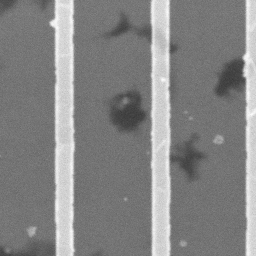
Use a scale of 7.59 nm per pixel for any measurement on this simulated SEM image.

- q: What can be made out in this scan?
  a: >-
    lines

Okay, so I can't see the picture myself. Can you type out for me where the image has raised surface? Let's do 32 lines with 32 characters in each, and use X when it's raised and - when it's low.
-------XX----------XX----------X
-------XX----------XX----------X
-------XX----------XX----------X
-------XX----------XX----------X
-------XX----------XX----------X
-------XX----------XX----------X
-------XX----------XX----------X
-------XX----------XX----------X
-------XX----------XX----------X
-------XX----------XX----------X
-------XX----------XX----------X
-------XX----------XX----------X
-------XX----------XX----------X
-------XX----------XX----------X
-------XX----------XX----------X
-------XX----------XX----------X
-------XX----------XX----------X
-------XX----------XX----------X
-------XX----------XX----------X
-------XX----------XX----------X
-------XX----------XX----------X
-------XX----------XX----------X
-------XX----------XX----------X
-------XX----------XX----------X
-------XX----------XX----------X
-------XX----------XX----------X
-------XX----------XX----------X
-------XX----------XX----------X
-------XX----------XX----------X
-------XX----------XX----------X
-------XX----------XX----------X
-------XX----------XX----------X